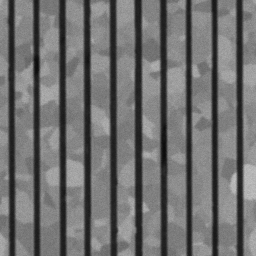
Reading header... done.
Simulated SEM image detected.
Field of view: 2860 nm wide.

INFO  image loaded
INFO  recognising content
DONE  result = parallel lines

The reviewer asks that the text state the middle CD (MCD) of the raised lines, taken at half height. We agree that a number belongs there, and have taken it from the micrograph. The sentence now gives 194 nm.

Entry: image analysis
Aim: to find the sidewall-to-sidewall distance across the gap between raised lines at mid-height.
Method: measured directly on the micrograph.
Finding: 0.0921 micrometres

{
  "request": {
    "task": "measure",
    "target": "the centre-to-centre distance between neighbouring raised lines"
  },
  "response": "0.283 µm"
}